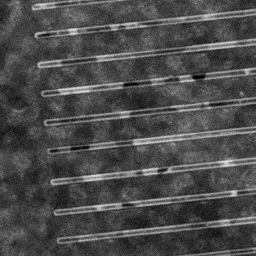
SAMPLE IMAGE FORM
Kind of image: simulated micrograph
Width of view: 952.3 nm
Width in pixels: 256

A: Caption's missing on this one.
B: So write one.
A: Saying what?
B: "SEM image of parallel lines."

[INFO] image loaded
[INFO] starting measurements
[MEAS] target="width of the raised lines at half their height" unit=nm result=21.3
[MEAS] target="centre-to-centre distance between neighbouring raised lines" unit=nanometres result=110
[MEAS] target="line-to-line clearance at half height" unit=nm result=88.8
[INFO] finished